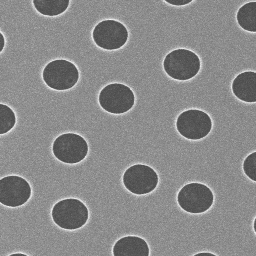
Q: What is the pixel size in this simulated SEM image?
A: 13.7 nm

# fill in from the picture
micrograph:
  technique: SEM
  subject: a regular array of holes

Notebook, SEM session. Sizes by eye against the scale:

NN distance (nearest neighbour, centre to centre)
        837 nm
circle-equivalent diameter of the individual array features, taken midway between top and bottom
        0.452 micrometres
